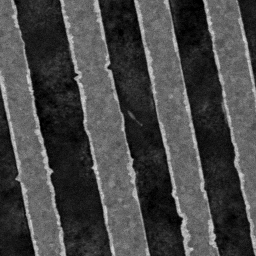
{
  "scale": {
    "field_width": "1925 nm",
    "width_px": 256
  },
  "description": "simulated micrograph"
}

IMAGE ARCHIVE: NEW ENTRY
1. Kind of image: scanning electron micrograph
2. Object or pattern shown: one or a few lines or trenches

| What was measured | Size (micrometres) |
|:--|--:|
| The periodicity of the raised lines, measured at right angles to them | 0.547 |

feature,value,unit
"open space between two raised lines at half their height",274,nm